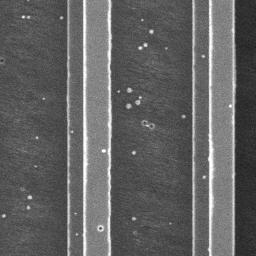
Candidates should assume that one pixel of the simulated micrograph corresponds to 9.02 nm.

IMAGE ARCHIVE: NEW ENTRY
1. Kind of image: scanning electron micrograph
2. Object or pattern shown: lines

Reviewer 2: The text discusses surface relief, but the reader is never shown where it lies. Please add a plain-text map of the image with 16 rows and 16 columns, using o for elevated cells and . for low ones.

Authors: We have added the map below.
.....oo......oo.
.....oo......oo.
.....oo......oo.
.....oo......oo.
.....oo......oo.
.....oo......oo.
.....oo......oo.
.....oo......oo.
.....oo......oo.
.....oo......oo.
.....oo......oo.
.....oo......oo.
.....oo......oo.
.....oo......oo.
.....oo......oo.
.....oo......oo.